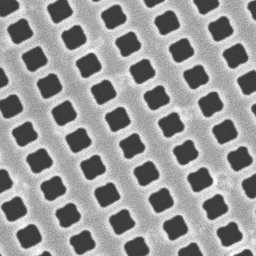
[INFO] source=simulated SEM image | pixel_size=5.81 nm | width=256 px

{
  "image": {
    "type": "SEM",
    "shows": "a regular array of holes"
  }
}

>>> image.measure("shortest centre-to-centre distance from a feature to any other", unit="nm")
178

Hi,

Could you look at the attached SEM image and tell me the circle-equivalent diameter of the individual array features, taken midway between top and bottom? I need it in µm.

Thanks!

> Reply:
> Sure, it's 0.139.